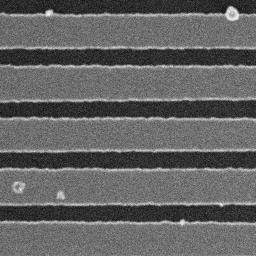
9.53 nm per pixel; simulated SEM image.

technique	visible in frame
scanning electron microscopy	lines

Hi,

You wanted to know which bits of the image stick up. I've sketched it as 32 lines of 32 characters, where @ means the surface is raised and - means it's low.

--------------------------------
------@---------------------@@--
@@@@@@@@@@@@@@@@@@@@@@@@@@@@@@@@
@@@@@@@@@@@@@@@@@@@@@@@@@@@@@@@@
@@@@@@@@@@@@@@@@@@@@@@@@@@@@@@@@
@@@@@@@@@@@@@@@@@@@@@@@@@@@@@@@@
--------------------------------
--------------------------------
@@@@@@@@@@@@@@@@@@@@@@@@@@@@@@@@
@@@@@@@@@@@@@@@@@@@@@@@@@@@@@@@@
@@@@@@@@@@@@@@@@@@@@@@@@@@@@@@@@
@@@@@@@@@@@@@@@@@@@@@@@@@@@@@@@@
@@@@@@@@@@@@@@@@@@@@@@@@@----@--
--------------------------------
--------------------------------
@@@@@@@@@@@@@@@@@@@@@@@@@@@@@@@@
@@@@@@@@@@@@@@@@@@@@@@@@@@@@@@@@
@@@@@@@@@@@@@@@@@@@@@@@@@@@@@@@@
@@@@@@@@@@@@@@@@@@@@@@@@@@@@@@@@
--------------------------------
--------------------------------
@@@@@@@@@@@@@@@@@@@@@@@@@@@@@@@@
@@@@@@@@@@@@@@@@@@@@@@@@@@@@@@@@
@@@@@@@@@@@@@@@@@@@@@@@@@@@@@@@@
@@@@@@@@@@@@@@@@@@@@@@@@@@@@@@@@
@@@@@@@@@@@@@@@@@@@@@@@@@@@@@@@@
--------------------------------
--------------------------------
@@@@@@@@@@@@@@@@@@@@@@@@@@@@@@@@
@@@@@@@@@@@@@@@@@@@@@@@@@@@@@@@@
@@@@@@@@@@@@@@@@@@@@@@@@@@@@@@@@
@@@@@@@@@@@@@@@@@@@@@@@@@@@@@@@@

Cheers